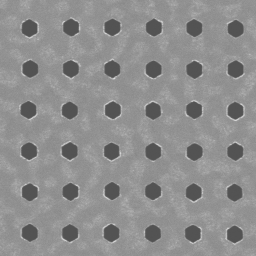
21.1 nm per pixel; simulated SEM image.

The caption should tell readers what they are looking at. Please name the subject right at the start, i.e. a regular array of holes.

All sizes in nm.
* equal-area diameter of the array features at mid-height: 355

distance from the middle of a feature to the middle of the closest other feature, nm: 851